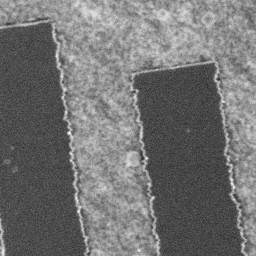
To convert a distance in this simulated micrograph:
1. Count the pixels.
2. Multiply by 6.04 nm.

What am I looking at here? one or a few lines or trenches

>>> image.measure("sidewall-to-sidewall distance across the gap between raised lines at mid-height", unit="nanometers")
423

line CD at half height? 0.505 microns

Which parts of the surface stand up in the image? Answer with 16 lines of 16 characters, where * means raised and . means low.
................
..*.............
****............
****............
****.....*****..
****....******..
****....******..
****.....*****..
****.....*****..
*****....*****..
*****....*****..
*****....******.
*****....******.
*****.....*****.
*****.....*****.
******....*****.